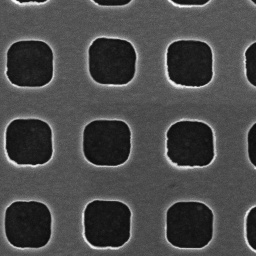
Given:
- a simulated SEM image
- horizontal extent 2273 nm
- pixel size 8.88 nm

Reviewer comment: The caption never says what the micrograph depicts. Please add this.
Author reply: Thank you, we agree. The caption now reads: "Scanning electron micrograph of a regular array of holes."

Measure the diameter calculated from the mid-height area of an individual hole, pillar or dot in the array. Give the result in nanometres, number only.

438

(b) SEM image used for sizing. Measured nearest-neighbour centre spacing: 78 px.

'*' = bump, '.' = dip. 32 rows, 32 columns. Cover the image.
************....******....******
********************************
********************************
********************************
********************************
**....*****.....*****.....******
*.....*****......****.....*****.
*......****......****.....*****.
*......****......****......****.
*......****......****.....*****.
**....****************....*****.
********************************
********************************
********************************
********************************
*.....*****.....******....******
*.....****......*****......****.
*.....****......*****......****.
*.....****......*****......****.
*.....*****.....*****......****.
***..*******...*******....******
********************************
********************************
********************************
********************************
*....******.....******...*******
*.....*****.....*****.....*****.
*.....****......*****......****.
*.....*****.....*****......****.
*.....*****.....*****......****.
*.....*****.....*****.....*****.
********************************